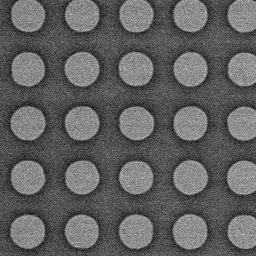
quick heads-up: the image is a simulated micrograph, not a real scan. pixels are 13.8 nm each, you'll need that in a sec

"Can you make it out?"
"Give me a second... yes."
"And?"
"an array of small figures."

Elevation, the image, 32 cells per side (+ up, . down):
..+++....+++...++++...+++....+++
..++++..++++...++++...++++...+++
..+++...++++...++++...++++...+++
..+++....+++....++.....++....+++
................................
................................
................................
..+++...++++...++++...+++....+++
..++++..++++...++++...++++...+++
..+++...++++...++++...++++...+++
..++.....++.....++.....++.....+.
................................
................................
...+.....++.....++.....++.....+.
..+++...++++...++++...++++...+++
.+++++..++++...++++...++++...+++
..+++...++++...++++...++++...+++
.......................+........
................................
................................
..+++....++.....++.....++....+++
.++++...++++...++++...++++...+++
.+++++..++++...++++...++++...+++
..+++....+++....+++...+++....+++
................................
................................
................................
..+++....+++....+++...+++....+++
.+++++..++++...++++...++++...+++
.++++...++++...++++...++++...+++
..+++....+++....++....+++....+++
................................